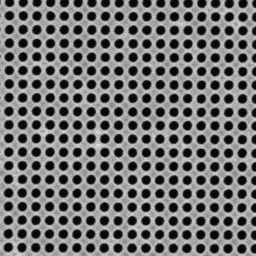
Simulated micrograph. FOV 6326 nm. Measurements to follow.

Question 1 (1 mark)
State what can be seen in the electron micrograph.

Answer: a regular array of holes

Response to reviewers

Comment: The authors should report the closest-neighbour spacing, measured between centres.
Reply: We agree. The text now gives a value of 332 nanometres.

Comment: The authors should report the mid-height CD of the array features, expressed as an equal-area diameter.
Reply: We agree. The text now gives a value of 248 nanometers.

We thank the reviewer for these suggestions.